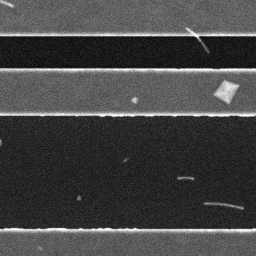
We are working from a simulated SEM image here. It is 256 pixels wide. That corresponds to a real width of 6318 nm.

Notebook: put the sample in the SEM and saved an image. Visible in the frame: lines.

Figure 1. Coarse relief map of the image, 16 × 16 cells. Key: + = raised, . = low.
++++++++++++++++
++++++++++++++++
................
................
++++++++++++++++
++++++++++++++++
++++++++++++++++
................
................
................
................
................
................
................
++++++++++++++++
++++++++++++++++